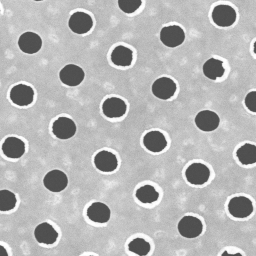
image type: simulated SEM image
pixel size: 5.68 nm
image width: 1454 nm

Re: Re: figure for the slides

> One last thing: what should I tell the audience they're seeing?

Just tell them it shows a regular array of holes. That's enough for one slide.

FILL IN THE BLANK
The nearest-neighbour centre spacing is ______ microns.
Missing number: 0.3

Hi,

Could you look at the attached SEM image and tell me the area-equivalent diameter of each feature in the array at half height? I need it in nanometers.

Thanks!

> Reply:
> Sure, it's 132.